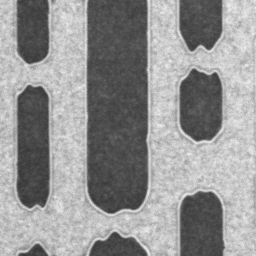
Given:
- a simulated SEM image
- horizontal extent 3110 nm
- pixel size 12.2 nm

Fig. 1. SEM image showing one or a few lines or trenches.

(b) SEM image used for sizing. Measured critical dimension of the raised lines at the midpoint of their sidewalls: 431 nm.